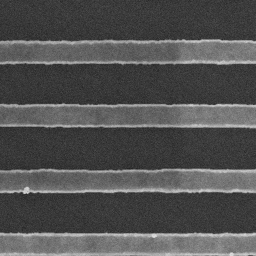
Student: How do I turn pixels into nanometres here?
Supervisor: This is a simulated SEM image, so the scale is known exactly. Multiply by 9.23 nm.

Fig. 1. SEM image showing lines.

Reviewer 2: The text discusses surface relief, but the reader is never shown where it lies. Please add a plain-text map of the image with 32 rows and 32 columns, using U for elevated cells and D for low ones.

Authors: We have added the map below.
DDDDDDDDDDDDDDDDDDDDDDDDDDDDDDDD
DDDDDDDDDDDDDDDDDDDDDDDDDDDDDDDD
DDDDDDDDDDDDDDDDDDDDDDDDDDDDDDDD
DDDDDDDDDDDDDDDDDDDDDDDDDDDDDDDD
DDDDDDDDDDDDDDDDDDDDDDDDDDDDDDDD
UUUUUUUUUUUUUUUUUUUUUUUUUUUUUUUU
UUUUUUUUUUUUUUUUUUUUUUUUUUUUUUUU
UUUUUUUUUUUUUUUUUUUUUUUUUUUUUUUU
DDDDDDDDDDDDDDDDDDDDDDDDDDDDDDDD
DDDDDDDDDDDDDDDDDDDDDDDDDDDDDDDD
DDDDDDDDDDDDDDDDDDDDDDDDDDDDDDDD
DDDDDDDDDDDDDDDDDDDDDDDDDDDDDDDD
DDDDDDDDDDDDDDDDDDDDDDDDDDDDDDDD
UUUUUUUUUUUUUUUUUUUUUUUUUUUUUUUU
UUUUUUUUUUUUUUUUUUUUUUUUUUUUUUUU
UUUUUUUUUUUUUUUUUUUUUUUUUUUUUUUU
DDDDDDDDDDDDDDDDDDDDDDDDDDDDDDDD
DDDDDDDDDDDDDDDDDDDDDDDDDDDDDDDD
DDDDDDDDDDDDDDDDDDDDDDDDDDDDDDDD
DDDDDDDDDDDDDDDDDDDDDDDDDDDDDDDD
DDDDDDDDDDDDDDDDDDDDDDDDDDDDDDDD
UUUUUUUUUUUUUUUUUUUUUUUUUUUUUUUU
UUUUUUUUUUUUUUUUUUUUUUUUUUUUUUUU
UUUUUUUUUUUUUUUUUUUUUUUUUUUUUUUU
DDDDDDDDDDDDDDDDDDDDDDDDDDDDDDDD
DDDDDDDDDDDDDDDDDDDDDDDDDDDDDDDD
DDDDDDDDDDDDDDDDDDDDDDDDDDDDDDDD
DDDDDDDDDDDDDDDDDDDDDDDDDDDDDDDD
DDDDDDDDDDDDDDDDDDDDDDDDDDDDDDDD
UUUUUUUUUUUUUUUUUUUUUUUUUUUUUUUU
UUUUUUUUUUUUUUUUUUUUUUUUUUUUUUUU
UUUUUUUUUUUUUUUUUUUUUUUUUUUUUUUU